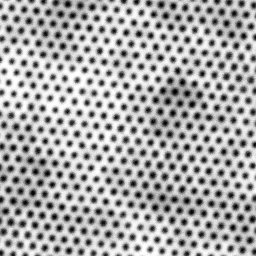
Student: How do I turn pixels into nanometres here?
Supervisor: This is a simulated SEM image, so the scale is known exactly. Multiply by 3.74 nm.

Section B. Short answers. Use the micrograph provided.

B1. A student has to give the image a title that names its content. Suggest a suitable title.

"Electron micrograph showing a regular array of holes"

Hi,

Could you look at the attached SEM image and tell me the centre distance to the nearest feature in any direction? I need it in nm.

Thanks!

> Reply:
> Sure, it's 44.8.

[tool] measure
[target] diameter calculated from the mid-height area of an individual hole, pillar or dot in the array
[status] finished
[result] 29.3 nm